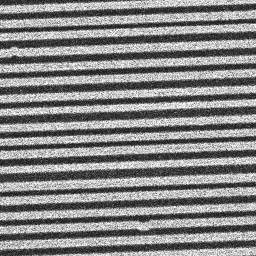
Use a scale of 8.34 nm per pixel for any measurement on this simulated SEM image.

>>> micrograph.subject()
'parallel lines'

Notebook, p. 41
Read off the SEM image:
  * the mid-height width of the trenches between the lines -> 55.2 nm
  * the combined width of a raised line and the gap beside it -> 123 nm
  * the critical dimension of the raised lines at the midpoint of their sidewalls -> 7.49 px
